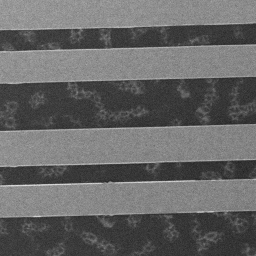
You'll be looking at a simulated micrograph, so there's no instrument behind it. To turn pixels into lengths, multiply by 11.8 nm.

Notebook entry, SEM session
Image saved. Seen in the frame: one or a few lines or trenches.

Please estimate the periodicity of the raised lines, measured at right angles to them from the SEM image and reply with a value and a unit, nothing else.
791 nm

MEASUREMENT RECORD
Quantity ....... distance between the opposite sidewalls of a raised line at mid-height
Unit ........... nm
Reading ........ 376